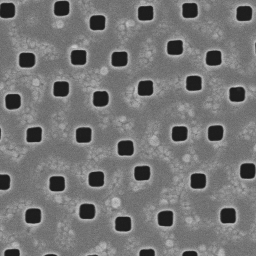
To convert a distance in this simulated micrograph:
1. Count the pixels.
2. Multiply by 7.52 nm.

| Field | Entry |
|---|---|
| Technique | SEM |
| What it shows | a regular array of holes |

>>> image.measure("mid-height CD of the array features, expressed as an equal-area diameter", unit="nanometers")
124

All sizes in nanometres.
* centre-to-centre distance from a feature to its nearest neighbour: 296